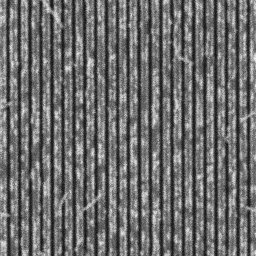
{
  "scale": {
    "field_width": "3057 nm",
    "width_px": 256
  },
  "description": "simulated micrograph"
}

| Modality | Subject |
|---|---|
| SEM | parallel lines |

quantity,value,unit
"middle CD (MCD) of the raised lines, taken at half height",83.6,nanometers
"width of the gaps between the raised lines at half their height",0.0418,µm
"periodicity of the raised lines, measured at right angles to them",130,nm